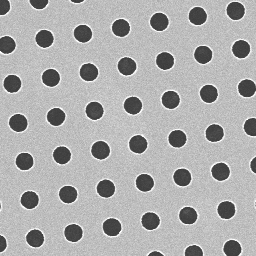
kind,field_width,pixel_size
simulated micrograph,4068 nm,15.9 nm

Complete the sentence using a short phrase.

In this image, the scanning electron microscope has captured a regular array of holes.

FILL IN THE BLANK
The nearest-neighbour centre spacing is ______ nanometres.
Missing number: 609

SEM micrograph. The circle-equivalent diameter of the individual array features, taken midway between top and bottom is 292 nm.